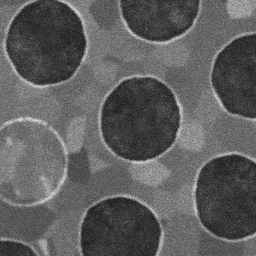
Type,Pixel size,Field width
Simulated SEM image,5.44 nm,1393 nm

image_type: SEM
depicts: holes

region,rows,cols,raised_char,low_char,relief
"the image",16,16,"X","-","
X---XXXX----XXXX
X----XXX----XXXX
-----XXXX--XXXX-
X----XXXXXXXXX--
X----XXXXXXXX---
XXXXXXX----XX---
XXXXXX-----XXX--
XXXXXX-----XXXXX
XXXXXX-----XXXXX
XXXXXXX---XXXXXX
XXXXXXXXXXXXX---
XXXXXXXXXXXX----
XXXXXX--XXXX----
XXXXX-----XX----
XXXXX-----XXX---
--XXX-----XXXXXX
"